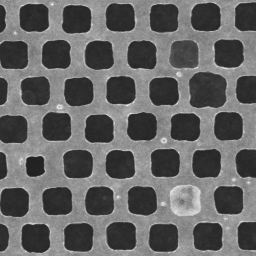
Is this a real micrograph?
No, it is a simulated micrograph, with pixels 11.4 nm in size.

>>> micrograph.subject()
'a regular array of holes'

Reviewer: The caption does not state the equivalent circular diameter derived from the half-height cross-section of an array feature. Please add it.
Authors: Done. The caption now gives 0.354 µm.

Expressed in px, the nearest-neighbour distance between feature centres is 41.5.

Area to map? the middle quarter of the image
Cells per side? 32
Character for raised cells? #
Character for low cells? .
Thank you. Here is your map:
.#####......####.......####.....
################################
################################
###...#####......######....#####
.......####.......####......###.
.......###........###........##.
........##........###........##.
........##........###........###
.......###........###........###
#......####......#####......###.
##...###########################
################################
.################.....######....
..####......####.......####.....
..###.......####.......####.....
..###.......####.......####.....
..###.......####.......####.....
..###.......####.......###......
.####.......####.......####.....
######......####################
################################
##...#######..#########.....####
.......####......#####.......###
.......###........####.......###
.......###........####.......###
.......###........####.......###
.......###........####.......###
.......####.......####.......###
#...########....################
################################
########.#########.#############
..####......####......##########